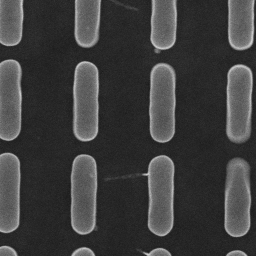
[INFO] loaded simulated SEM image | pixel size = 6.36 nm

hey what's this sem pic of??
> groups of lines, slits or small figures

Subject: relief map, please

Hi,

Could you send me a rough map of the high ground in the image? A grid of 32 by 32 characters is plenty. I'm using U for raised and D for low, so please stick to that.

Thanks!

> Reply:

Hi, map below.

UUUDDDDDDUUUDDDDDDDUUUDDDDDDDUUU
UUUDDDDDDUUUDDDDDDDUUUDDDDDDDUUU
UUUDDDDDDUUUDDDDDDDUUUDDDDDDDUUU
UUUDDDDDDUUUDDDDDDDUUUDDDDDDDUUU
UUUDDDDDDUUUDDDDDDDUUUDDDDDDDUUU
UUDDDDDDDDUUDDDDDDDUUUDDDDDDDUUD
DDDDDDDDDDDDDDDDDDDDDDDDDDDDDDDD
DDDDDDDDDDDDDDDDDDDDDDDDDDDDDDDD
UUDDDDDDDDUUDDDDDDDUUDDDDDDDDUUD
UUDDDDDDDUUUDDDDDDDUUUDDDDDDDUUD
UUDDDDDDDUUUDDDDDDDUUUDDDDDDUUUD
UUUDDDDDDUUUDDDDDDDUUUDDDDDDUUUD
UUUDDDDDDUUUDDDDDDDUUUDDDDDDDUUD
UUUDDDDDDUUUDDDDDDDUUUDDDDDDDUUD
UUUDDDDDDUUUDDDDDDDUUUDDDDDDDUUD
UUUDDDDDDUUUDDDDDDDUUUDDDDDDDUUD
UUDDDDDDDUUUDDDDDDDUUUDDDDDDDUUD
DDDDDDDDDDUDDDDDDDDUUDDDDDDDDUDD
DDDDDDDDDDDDDDDDDDDDDDDDDDDDDDDD
UUDDDDDDDDUDDDDDDDDDUDDDDDDDDDDD
UUDDDDDDDUUUDDDDDDDUUUDDDDDDDUDD
UUDDDDDDDUUUDDDDDDUUUUDDDDDDDUUD
UUDDDDDDDUUUDDDDDDDUUUDDDDDDDUUD
UUDDDDDDDUUUDDDDDDDUUUDDDDDDUUUD
UUDDDDDDDUUUDDDDDDDUUUDDDDDDUUUD
UUDDDDDDDUUUDDDDDDDUUUDDDDDDUUUD
UUDDDDDDDUUUDDDDDDDUUUDDDDDDUUUD
UUDDDDDDDUUUDDDDDDDUUUDDDDDDUUUD
UUDDDDDDDUUUDDDDDDDUUDDDDDDDUUUD
DDDDDDDDDDDDDDDDDDDDDDDDDDDDDDDD
DDDDDDDDDDDDDDDDDDDDDDDDDDDDDDDD
UUDDDDDDDUUUDDDDDDDUUDDDDDDDDUDD